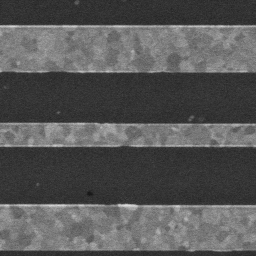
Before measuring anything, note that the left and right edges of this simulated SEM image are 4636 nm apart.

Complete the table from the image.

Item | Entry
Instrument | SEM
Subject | lines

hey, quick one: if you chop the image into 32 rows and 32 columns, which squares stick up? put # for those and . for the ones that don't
................................
................................
................................
################################
################################
################################
################################
################################
################################
................................
................................
................................
................................
................................
................................
############....................
################################
################################
................................
................................
................................
................................
................................
................................
................................
................................
################################
################################
################################
################################
################################
................................